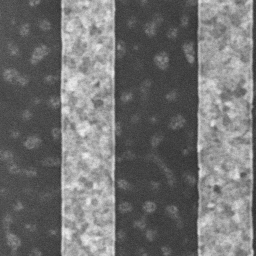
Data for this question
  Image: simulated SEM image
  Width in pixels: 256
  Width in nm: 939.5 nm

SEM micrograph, one or a few lines or trenches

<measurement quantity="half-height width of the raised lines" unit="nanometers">188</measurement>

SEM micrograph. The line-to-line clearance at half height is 316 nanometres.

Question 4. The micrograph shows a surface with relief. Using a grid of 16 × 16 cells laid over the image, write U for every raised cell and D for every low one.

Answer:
DDDDUUUDDDDDUUUU
DDDDUUUDDDDDUUUU
DDDDUUUDDDDDUUUU
DDDDUUUDDDDDUUUU
DDDDUUUDDDDDUUUU
DDDDUUUDDDDDUUUU
DDDDUUUDDDDDUUUU
DDDDUUUDDDDDUUUU
DDDDUUUDDDDDUUUU
DDDDUUUDDDDDUUUU
DDDDUUUDDDDDDUUU
DDDDUUUDDDDDUUUU
DDDDUUUDDDDDDUUU
DDDDUUUDDDDDUUUU
DDDDUUUDDDDDUUUU
DDDDUUUDDDDDDUUU